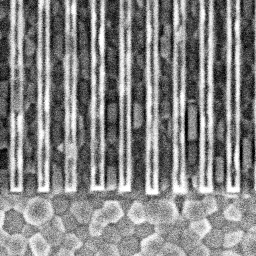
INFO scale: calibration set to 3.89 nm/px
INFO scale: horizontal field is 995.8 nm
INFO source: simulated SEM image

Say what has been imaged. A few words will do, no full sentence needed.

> parallel lines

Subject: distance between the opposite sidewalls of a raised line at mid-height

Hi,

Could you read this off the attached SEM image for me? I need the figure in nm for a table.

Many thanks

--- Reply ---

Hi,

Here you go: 41.8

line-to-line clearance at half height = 61.2 nm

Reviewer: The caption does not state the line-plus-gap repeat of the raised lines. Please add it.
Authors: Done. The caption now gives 105 nanometers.